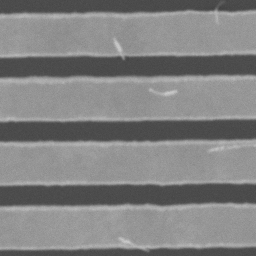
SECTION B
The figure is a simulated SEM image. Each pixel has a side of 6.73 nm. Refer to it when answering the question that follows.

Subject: lines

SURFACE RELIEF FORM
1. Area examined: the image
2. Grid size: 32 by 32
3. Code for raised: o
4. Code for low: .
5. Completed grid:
................................
......................oooooooooo
oooooooooooooooooooooooooooooooo
oooooooooooooooooooooooooooooooo
oooooooooooooooooooooooooooooooo
oooooooooooooooooooooooooooooooo
oooooooooooooooooooooooooooooooo
................................
................................
.......................o.ooooooo
oooooooooooooooooooooooooooooooo
oooooooooooooooooooooooooooooooo
oooooooooooooooooooooooooooooooo
oooooooooooooooooooooooooooooooo
oooooooooooooooooooooooooooooooo
................................
................................
...............................o
oooooooooooooooooooooooooooooooo
oooooooooooooooooooooooooooooooo
oooooooooooooooooooooooooooooooo
oooooooooooooooooooooooooooooooo
oooooooooooooooooooooooooooooooo
................................
................................
..................o....ooooooooo
oooooooooooooooooooooooooooooooo
oooooooooooooooooooooooooooooooo
oooooooooooooooooooooooooooooooo
oooooooooooooooooooooooooooooooo
oooooooooooooooooooooooooooooooo
................................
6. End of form